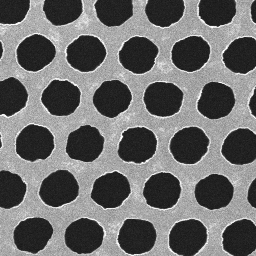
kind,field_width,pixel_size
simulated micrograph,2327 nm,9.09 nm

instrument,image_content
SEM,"a regular array of holes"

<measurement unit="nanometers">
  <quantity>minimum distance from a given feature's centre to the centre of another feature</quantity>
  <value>464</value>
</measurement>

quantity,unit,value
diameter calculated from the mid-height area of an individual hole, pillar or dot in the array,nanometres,339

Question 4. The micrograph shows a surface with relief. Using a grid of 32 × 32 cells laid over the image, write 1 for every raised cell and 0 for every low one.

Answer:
00001000001100000100000110000110
00011100001100000100000110000010
00011100011100001110001110000111
11111111111111111111111111111111
11110111110011111111111111111111
11000001100001110001110000111000
11000001000001100000100000110000
11000001000001100001100000110000
11100111100011110001110001111000
11111111111111111111111111111111
00011100011110001110001111001111
00011000001100001100000110000111
00011000001100001100000110000110
00011100001100001100001110000110
11111111111110011111011111001111
11111111111111111111111111111111
11100011100011110001110001111000
11000001000001100000100000110000
11000001000001100001100000110000
11000011100011100001110001110000
11111111111111111111111111111011
01111110011111111111111111111111
00011100011100001100001110000111
00011000001100001100000100000110
00011000001000001100001100000110
00111100111100011110001110000110
11111111111111111111111111111111
11100011110111110111111001111101
11000001000001100001110000110000
11000011000001100000100000110000
11000011000001100001100000110000
11110111100011110011110001110000